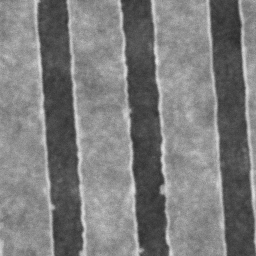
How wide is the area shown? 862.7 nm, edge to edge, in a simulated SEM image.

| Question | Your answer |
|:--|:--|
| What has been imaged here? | one or a few lines or trenches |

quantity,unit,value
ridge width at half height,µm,0.18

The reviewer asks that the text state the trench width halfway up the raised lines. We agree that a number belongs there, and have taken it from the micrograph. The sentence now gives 107 nanometers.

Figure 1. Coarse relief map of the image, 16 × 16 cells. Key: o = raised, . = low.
oo..oooo..ooo..o
oo..oooo..ooo..o
oo..oooo..ooo..o
oo...ooo..ooo..o
ooo..ooo..ooo..o
ooo..ooo..ooo..o
ooo..ooo..oooo.o
ooo..ooo..ooo..o
ooo..ooo..oooo..
ooo..ooo..oooo..
ooo..ooo..oooo..
ooo..ooo..oooo..
ooo..ooo..oooo..
ooo..ooo..oooo..
ooo..ooo..oooo..
ooo..oooo..ooo..